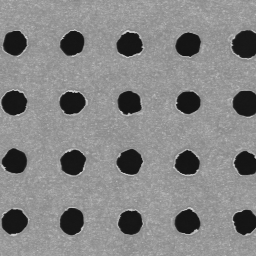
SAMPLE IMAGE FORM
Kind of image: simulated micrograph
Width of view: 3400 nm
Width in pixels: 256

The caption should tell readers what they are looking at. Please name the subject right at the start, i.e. a regular array of holes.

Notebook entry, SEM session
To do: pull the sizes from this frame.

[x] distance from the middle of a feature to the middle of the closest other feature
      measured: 760 nm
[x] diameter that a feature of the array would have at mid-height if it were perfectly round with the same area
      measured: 323 nanometers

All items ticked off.